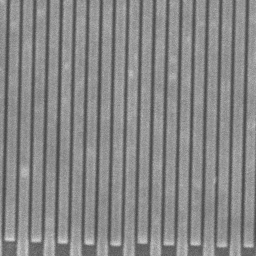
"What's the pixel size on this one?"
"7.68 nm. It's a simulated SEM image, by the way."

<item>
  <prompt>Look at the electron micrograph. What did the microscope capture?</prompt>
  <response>parallel lines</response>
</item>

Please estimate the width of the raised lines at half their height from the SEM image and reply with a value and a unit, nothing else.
72 nm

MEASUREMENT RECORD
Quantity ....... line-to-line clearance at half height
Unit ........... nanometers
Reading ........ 28.8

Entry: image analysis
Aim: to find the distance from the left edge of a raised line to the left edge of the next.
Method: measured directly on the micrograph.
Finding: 102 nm